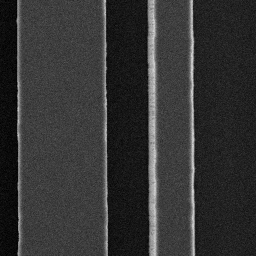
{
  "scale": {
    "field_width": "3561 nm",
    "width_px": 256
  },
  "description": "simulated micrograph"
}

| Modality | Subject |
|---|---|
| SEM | lines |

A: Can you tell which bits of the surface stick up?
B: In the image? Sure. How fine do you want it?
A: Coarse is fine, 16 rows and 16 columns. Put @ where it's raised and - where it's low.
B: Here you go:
-@@@@@@---@@----
-@@@@@@---@@----
-@@@@@@---@@----
-@@@@@@---@@----
-@@@@@@---@@----
-@@@@@@---@@----
-@@@@@@---@@----
-@@@@@@---@@----
-@@@@@@---@@----
-@@@@@@---@@----
-@@@@@@---@@----
-@@@@@@---@@----
-@@@@@@---@@----
-@@@@@@---@@----
-@@@@@@---@@----
-@@@@@@---@@----